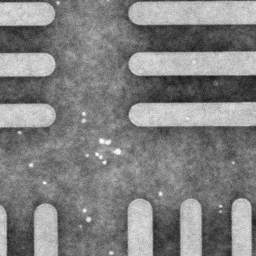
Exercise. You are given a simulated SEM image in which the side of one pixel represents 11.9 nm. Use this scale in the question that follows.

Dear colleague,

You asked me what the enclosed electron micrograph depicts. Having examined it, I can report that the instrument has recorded groups of lines, slits or small figures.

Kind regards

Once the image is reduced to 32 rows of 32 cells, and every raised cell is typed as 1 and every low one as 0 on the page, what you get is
11111100000000000111111111111111
11111110000000001111111111111111
11111110000000001111111111111111
00000000000000000000000000000000
00000000000000000000000000000000
00000000000000000000000000000000
00000000000000000000000000000000
11111110000000001111111111111111
11111110000000001111111111111111
00000000000000000000000000000000
00000000000000000000000000000000
00000000000000000000000000000000
00000000000000000000000000000000
11111100000000000111111111111111
11111110000000001111111111111111
11111100000000000111111111111111
00000000000000000000000000000000
00000000000000000000000000000000
00000000000000000000000000000000
00000000000000000000000000000000
00000000000000000000000000000000
00000000000000000000000000000000
00000000000000000000000000000000
00000000000000000000000000000000
00000000000000000000000000000000
00000000000000001110000110000110
10001110000000001110000110000110
10001110000000001110000110000110
10001110000000001110000110000110
10001110000000001110000110000110
10001110000000001110000110000110
10001110000000001110000110000110